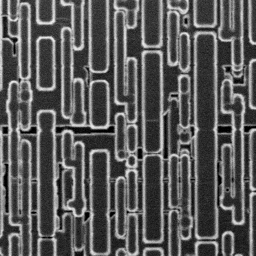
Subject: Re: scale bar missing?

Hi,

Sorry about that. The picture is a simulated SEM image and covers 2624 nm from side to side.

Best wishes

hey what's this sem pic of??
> wiring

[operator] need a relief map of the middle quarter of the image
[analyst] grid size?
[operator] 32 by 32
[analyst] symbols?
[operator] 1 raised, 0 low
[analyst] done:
11000011111001111100111100000110
11000001111001111100111100000110
11000000000001111100111100000000
11000000000001111100111100000110
11111001111001111100111100000110
11111001111001111100111100000110
11111001111001111100111100000110
11111001111001111100111100000110
11111001111001111100111100000110
11111001111001111100111100000110
11111001111000001100111100000110
11111001111000001100111100000110
11111001111000011100111100000110
01111001111001111100111100000110
00111001111001111000111100000110
00000001111001111100111100000110
00000000000001111100111100000000
11000000000001111100111100000000
11000000000001111100111100000000
11000000000001111100111100000000
11111000000001111100111100000000
11111000000001111100111100000000
11111001111001111000011100000000
11111001111001111100111100111110
11111001111000001100111110111110
11111001111000001100111110111110
00111001111000001100111110111110
00111001111000001100111110111110
00111001111000101100111110111110
00011001111001111100111110111110
00111001111001111100111110111110
00111001111001111100111110111110